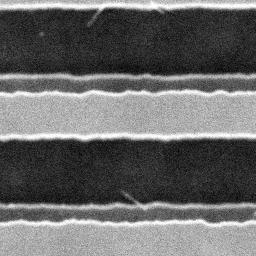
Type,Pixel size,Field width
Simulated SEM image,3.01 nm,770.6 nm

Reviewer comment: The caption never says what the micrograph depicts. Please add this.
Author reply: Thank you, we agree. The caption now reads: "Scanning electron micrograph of lines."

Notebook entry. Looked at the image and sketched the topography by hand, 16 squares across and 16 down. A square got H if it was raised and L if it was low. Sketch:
LLLLLLLLLLLLLLLL
LLLLLLLLLLLLLLLL
LLLLLLLLLLLLLLLL
LLLLLLLLLLLLLLLL
LLLLLLLLLLLLLLLL
LLLLLLLLLLLLLLLL
HHHHHHHHHHHHHHHH
HHHHHHHHHHHHHHHH
HHHHHHHLHHHHLLLH
LLLLLLLLLLLLLLLL
LLLLLLLLLLLLLLLL
LLLLLLLLLLLLLLLL
LLLLLLLLLLLLLLLL
LLLLLLLLLLLLLLLL
HHHHHHHHHHHHHHHH
HHHHHHHHHHHHHHHH